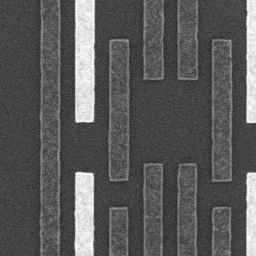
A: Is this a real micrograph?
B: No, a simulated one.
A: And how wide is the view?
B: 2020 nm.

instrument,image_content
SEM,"wiring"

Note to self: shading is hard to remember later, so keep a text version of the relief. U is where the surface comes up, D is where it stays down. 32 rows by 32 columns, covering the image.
DDDDDUUDDDUUDDDDDDUUDDUUUDDDDDDU
DDDDDUUDDDUUDDDDDDUUDDUUUDDDDDDU
DDDDDUUDDDUUDDDDDDUUDDUUUDDDDDDU
DDDDDUUDDDUUDDDDDDUUDDUUUDDDDDDU
DDDDDUUDDDUUDDDDDDUUDDUUUDDDDDDU
DDDDDUUDDDUUDDUUDDUUDDUUUDDUUDDU
DDDDDUUDDDUUDDUUDDUUDDUUUDDUUDDU
DDDDDUUDDDUUDDUUDDUUDDUUUDDUUDDU
DDDDDUUDDDUUDDUUDDUUDDUUUDDUUDDU
DDDDDUUDDDUUDDUUDDUUDDUUUDDUUDDU
DDDDDUUDDDUUDDUUDDDDDDDDDDDUUDDU
DDDDDUUDDDUUDDUUDDDDDDDDDDDUUDDU
DDDDDUUDDDUUDDUUDDDDDDDDDDDUUDDU
DDDDDUUDDDUUDDUUDDDDDDDDDDDUUDDU
DDDDDUUDDDUUDDUUDDDDDDDDDDDUUDDU
DDDDDUUDDDDDDDUUDDDDDDDDDDDUUDDD
DDDDDUUDDDDDDDUUDDDDDDDDDDDUUDDD
DDDDDUUDDDDDDDUUDDDDDDDDDDDUUDDD
DDDDDUUDDDDDDDUUDDDDDDDDDDDUUDDD
DDDDDUUDDDDDDDUUDDDDDDDDDDDUUDDD
DDDDDUUDDDDDDDUUDDDDDDDDDDDUUDDD
DDDDDUUDDDDDDDUUDDUUDDUUUDDUUDDD
DDDDDUUDDDUUDDUUDDUUDDUUUDDUUDDU
DDDDDUUDDDUUDDDDDDUUDDUUUDDDDDDU
DDDDDUUDDDUUDDDDDDUUDDUUUDDDDDDU
DDDDDUUDDDUUDDDDDDUUDDUUDDDDDDDU
DDDDDUUDDDUUDDUUDDUUDDUUUDDUUDDU
DDDDDUUDDDUUDDUUDDUUDDUUUDDUUDDU
DDDDDUUDDDUUDDUUDDUUDDUUUDDUUDDU
DDDDDUUDDDUUDDUUDDUUDDUUUDDUUDDU
DDDDDUUDDDUUDDUUDDUUDDUUUDDUUDDU
DDDDDUUDDDUUDDUUDDUUDDUUUDDUUDDU